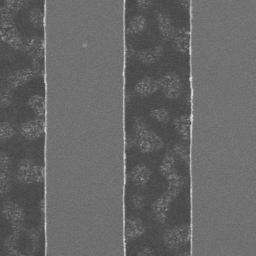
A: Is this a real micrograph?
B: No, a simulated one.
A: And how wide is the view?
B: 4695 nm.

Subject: one or a few lines or trenches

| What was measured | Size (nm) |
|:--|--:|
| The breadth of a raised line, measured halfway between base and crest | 1230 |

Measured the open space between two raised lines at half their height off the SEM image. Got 1.43 microns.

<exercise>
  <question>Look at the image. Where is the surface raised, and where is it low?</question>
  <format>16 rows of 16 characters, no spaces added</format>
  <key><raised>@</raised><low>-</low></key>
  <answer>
@@@-----@@@@----
@@@-----@@@@----
@@@-----@@@@----
@@@-----@@@@----
@@@-----@@@@----
@@@-----@@@@----
@@@-----@@@@----
@@@-----@@@@----
@@@-----@@@@----
@@@-----@@@@----
@@@-----@@@@----
@@@-----@@@@----
@@@-----@@@@----
@@@-----@@@@----
@@@-----@@@@----
@@@-----@@@@----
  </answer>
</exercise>